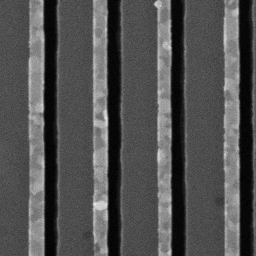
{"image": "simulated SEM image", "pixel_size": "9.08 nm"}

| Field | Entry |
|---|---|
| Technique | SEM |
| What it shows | lines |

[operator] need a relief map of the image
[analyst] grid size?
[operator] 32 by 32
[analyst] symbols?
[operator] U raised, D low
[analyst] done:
UUUUUDDUUUUUUDDUUUUUUDDUUUUUUUDD
UUUUUDDUUUUUUDDUUUUUUDDUUUUUUUDD
UUUUUDDUUUUUUDDUUUUUUDDUUUUUUUDD
UUUUUDDUUUUUUDDUUUUUUDDUUUUUUUDD
UUUUUDDUUUUUUDDUUUUUUDDUUUUUUUDD
UUUUUDDUUUUUUDDUUUUUUDDUUUUUUUDD
UUUUUDDUUUUUUDDUUUUUUDDUUUUUUUDD
UUUUUDDUUUUUUDDUUUUUUDDUUUUUUUDD
UUUUUDDUUUUUUDDUUUUUUDDUUUUUUUDD
UUUUUDDUUUUUUDDUUUUUUDDUUUUUUUDD
UUUUUDDUUUUUUDDUUUUUUDDUUUUUUUDD
UUUUUDDUUUUUUDDUUUUUUDDUUUUUUUDD
UUUUUDDUUUUUUDDUUUUUUDDUUUUUUUDD
UUUUUDDUUUUUUDDUUUUUUDDUUUUUUUDD
UUUUUDDUUUUUUDDUUUUUUDDUUUUUUUDD
UUUUUDDUUUUUUDDUUUUUUDDUUUUUUUDD
UUUUUDDUUUUUUDDUUUUUUDDUUUUUUUDD
UUUUUDDUUUUUUDDUUUUUUDDUUUUUUUDD
UUUUUDDUUUUUUDDUUUUUUDDUUUUUUUDD
UUUUUDDUUUUUUDDUUUUUUDDUUUUUUUDD
UUUUUDDUUUUUUDDUUUUUUDDUUUUUUUDD
UUUUUDDUUUUUUDDUUUUUUDDUUUUUUUDD
UUUUUDDUUUUUUDDUUUUUUDDUUUUUUUDD
UUUUUDDUUUUUUDDUUUUUUDDUUUUUUUDD
UUUUUDDUUUUUUDDUUUUUUDDUUUUUUUDD
UUUUUDDUUUUUUDDUUUUUUDDUUUUUUUDD
UUUUUDDUUUUUUDDUUUUUUDDUUUUUUUDD
UUUUUDDUUUUUUDDUUUUUUDDUUUUUUUDD
UUUUUDDUUUUUUDDUUUUUUDDUUUUUUUDD
UUUUUDDUUUUUUDDUUUUUUDDUUUUUUUDD
UUUUUDDUUUUUUDDUUUUUUDDUUUUUUUDD
UUUUUDDUUUUUUDDUUUUUUDDUUUUUUUDD